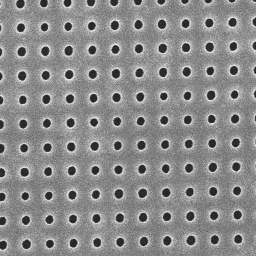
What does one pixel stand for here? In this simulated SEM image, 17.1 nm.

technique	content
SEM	a regular array of holes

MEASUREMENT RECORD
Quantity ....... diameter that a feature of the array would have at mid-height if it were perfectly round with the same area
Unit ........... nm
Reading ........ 151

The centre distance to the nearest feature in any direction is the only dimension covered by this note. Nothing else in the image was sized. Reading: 402 nanometres